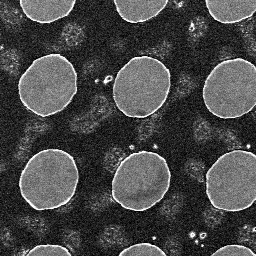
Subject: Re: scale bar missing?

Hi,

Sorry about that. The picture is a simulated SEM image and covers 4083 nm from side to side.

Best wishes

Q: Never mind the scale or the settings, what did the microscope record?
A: raised bodies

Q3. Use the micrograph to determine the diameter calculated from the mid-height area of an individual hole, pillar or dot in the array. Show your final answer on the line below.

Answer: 923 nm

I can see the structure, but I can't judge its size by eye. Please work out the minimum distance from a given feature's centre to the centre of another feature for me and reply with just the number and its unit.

1470 nanometres